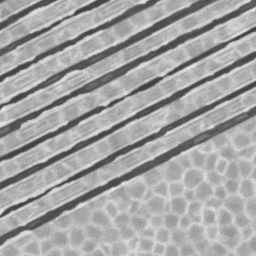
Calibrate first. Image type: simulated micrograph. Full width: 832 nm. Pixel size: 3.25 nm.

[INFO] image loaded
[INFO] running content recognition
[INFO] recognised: parallel lines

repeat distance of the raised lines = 77.5 nm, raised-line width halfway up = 17.8 pixels